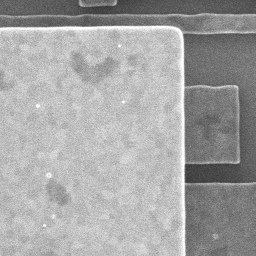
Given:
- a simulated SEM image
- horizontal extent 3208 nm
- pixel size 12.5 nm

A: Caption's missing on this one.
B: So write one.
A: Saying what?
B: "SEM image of wiring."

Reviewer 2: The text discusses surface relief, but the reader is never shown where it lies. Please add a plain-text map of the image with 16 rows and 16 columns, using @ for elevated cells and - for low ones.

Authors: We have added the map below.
----------------
----------------
@@@@@@@@@@@-----
@@@@@@@@@@@-----
@@@@@@@@@@@-----
@@@@@@@@@@@-----
@@@@@@@@@@@-----
@@@@@@@@@@@-----
@@@@@@@@@@@-----
@@@@@@@@@@@@----
@@@@@@@@@@@@----
@@@@@@@@@@@-----
@@@@@@@@@@@@----
@@@@@@@@@@@@----
@@@@@@@@@@@@----
@@@@@@@@@@@@----